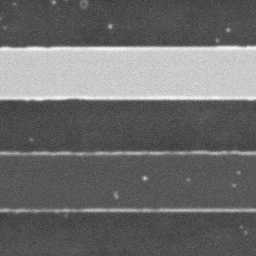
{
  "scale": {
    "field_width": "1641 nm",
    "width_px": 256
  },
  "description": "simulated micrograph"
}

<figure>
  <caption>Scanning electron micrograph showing lines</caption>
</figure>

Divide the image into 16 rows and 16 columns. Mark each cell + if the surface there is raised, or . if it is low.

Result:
................
................
................
++++++++++++++++
++++++++++++++++
++++++++++++++++
................
................
................
............+.+.
++++++++++++++++
++++++++++++++++
++++++++++++++++
................
................
................